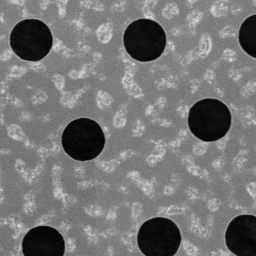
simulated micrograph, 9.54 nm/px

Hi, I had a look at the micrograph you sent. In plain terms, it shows holes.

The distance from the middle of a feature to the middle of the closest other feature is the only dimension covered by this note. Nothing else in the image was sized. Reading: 108 pixels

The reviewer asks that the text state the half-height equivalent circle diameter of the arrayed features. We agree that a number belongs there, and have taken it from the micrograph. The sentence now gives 0.411 um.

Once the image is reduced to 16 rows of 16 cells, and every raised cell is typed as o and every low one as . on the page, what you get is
oooooooooooooooo
o..ooooo..ooooo.
o..ooooo..ooooo.
o..ooooo..oooooo
oooooooooooooooo
oooooooooooooooo
oooooooooooo..oo
ooooo.oooooo..oo
oooo..oooooo..oo
oooo..oooooooooo
oooooooooooooooo
oooooooooooooooo
oooooooooooooooo
ooooooooooooooo.
oo..ooooo..ooo..
o...ooooo..ooo..